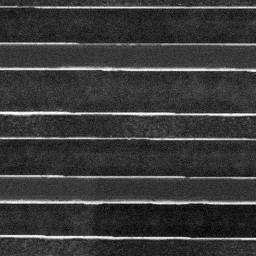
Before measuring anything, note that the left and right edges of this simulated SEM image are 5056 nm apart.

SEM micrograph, lines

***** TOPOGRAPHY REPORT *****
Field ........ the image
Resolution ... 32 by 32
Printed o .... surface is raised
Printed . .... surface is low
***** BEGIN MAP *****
oooooooooooooooooooooooooooooooo
................................
................................
................................
................................
ooooooooo.......................
oooooooooooooooooooooooooooooooo
oooooooooooooooooooooooooooooooo
oooooooooooooooooooooooooooooooo
................................
................................
................................
................................
................................
oooooooooooooooooooooooooooooooo
oooooooooooooooooooooooooooooooo
oooooooooooooooooooooooooooooooo
................................
................................
................................
................................
................................
oooooooooooooooooooooooooooooooo
oooooooooooooooooooooooooooooooo
oooooooooooooooooooooooooooooooo
................................
................................
................................
................................
oooo............................
oooooooooooooooooooooooooooooooo
oooooooooooooooooooooooooooooooo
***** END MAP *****